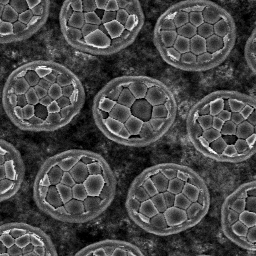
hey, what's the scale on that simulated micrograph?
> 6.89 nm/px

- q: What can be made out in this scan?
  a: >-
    raised bodies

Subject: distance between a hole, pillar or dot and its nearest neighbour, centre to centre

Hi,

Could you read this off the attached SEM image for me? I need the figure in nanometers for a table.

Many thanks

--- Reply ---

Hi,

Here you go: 643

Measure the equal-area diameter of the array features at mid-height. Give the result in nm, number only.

481